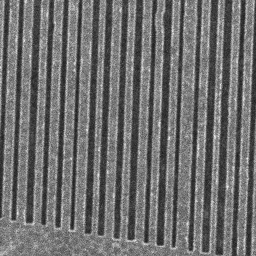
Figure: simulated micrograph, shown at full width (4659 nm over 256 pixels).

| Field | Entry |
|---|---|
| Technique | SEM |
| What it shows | parallel lines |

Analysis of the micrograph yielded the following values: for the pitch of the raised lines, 268 nm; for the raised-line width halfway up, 7.75 px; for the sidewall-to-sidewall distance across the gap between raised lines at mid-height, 111 nanometres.